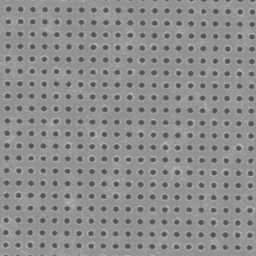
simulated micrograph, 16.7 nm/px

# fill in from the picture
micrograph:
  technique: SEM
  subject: a regular array of holes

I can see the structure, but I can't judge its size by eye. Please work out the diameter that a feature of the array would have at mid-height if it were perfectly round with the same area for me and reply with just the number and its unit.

96.1 nm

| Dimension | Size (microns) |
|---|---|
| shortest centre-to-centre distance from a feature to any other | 0.201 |